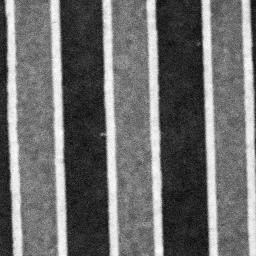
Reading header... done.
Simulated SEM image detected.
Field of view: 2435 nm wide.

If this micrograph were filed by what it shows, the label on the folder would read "one or a few lines or trenches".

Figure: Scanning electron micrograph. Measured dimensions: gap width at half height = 513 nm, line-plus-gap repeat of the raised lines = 921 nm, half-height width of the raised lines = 418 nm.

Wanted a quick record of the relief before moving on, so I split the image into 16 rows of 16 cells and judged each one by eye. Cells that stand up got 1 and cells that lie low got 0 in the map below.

0110000110000110
0111000111000110
0110000111000110
0111000111000110
0111000111000111
0111000111000111
0111000111000111
0111000111000111
0111000111000111
0111000111000111
0111000111000111
0111000111000111
0111000111000111
0111000111000111
0111000111000111
0111000111000111